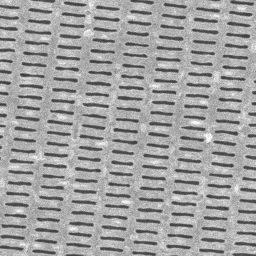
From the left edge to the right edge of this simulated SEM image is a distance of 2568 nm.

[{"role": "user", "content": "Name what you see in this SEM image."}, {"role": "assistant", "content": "a regular array of holes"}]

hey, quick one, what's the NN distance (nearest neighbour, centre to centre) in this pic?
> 108 nanometres